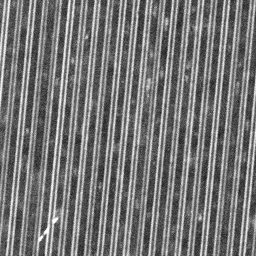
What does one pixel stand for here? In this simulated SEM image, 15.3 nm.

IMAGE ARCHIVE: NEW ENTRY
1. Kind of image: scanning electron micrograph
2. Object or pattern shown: parallel lines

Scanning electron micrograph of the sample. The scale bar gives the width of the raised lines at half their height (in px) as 4.73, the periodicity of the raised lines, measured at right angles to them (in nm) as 197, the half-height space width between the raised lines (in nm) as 128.